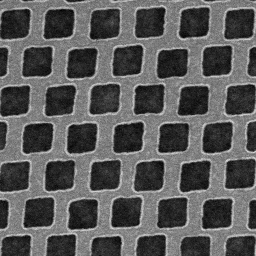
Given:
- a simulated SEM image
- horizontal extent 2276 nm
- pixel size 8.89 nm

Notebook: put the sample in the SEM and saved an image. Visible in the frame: a regular array of holes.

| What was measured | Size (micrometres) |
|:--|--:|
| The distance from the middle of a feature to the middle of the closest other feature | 0.383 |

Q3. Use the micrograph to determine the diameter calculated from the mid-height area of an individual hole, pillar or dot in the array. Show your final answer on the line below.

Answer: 299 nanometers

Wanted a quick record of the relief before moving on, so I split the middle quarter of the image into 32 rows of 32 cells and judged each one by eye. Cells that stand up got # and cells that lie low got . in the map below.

#.......####........###........#
#.......####.......####........#
........####.......####........#
#......#################..######
################################
...####.......####.......######.
...####.......####.......####...
...###........####.......####...
...###........###........####...
...###........###........####...
...###........###........###....
...###........###........###....
..####....##.#####......#####...
################################
######.##########...############
#........####.......####.......#
#........###........####........
#.......####........####.......#
#.......####........####.......#
........####........###........#
........####........###........#
#.......####.......####........#
##..#########.##################
################################
...####.......#####......#######
...####.......####.......####...
...####.......####.......####...
...###........###........####...
...###........###........####...
...###........###........####...
..####........###........####...
#######.....#####.......#####...